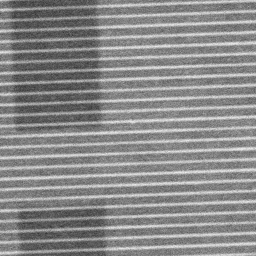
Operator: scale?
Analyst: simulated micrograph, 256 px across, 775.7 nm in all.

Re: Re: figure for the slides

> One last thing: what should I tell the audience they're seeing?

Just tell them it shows parallel lines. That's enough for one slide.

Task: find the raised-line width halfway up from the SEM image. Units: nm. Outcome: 5.3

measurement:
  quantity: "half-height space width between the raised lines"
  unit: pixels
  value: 8.38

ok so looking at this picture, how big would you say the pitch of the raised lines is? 32 nm